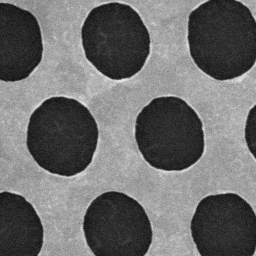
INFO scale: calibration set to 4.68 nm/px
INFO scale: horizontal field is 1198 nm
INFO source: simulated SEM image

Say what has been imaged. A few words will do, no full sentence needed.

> holes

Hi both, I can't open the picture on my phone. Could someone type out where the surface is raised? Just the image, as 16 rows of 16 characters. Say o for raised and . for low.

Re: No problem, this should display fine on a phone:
.ooooo..oooo...o
..ooo....ooo....
...oo....ooo....
...oo....ooo....
..oooo...oooo..o
oooooooooooooooo
ooo..oooo...oooo
oo....ooo....oo.
oo....oo.....oo.
oo....ooo....ooo
ooo..ooooo..oooo
oooooooooooooooo
..oooo..ooooo..o
..ooo....ooo....
...oo....ooo....
...ooo...ooo....